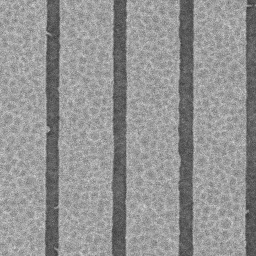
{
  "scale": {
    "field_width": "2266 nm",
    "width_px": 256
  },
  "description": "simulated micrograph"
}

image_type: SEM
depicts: one or a few lines or trenches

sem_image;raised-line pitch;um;0.591